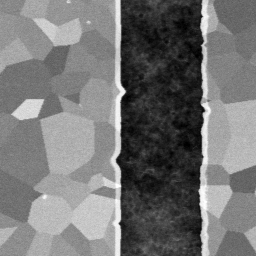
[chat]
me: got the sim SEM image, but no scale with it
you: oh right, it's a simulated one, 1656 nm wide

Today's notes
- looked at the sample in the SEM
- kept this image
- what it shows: one or a few lines or trenches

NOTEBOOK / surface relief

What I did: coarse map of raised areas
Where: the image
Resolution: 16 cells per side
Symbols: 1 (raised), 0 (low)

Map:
1111111000000111
1111111000000111
1111111000000111
1111111000000111
1111111000000111
1111111100000111
1111111000000111
1111111000000111
1111111000000111
1111111000000111
1111111000000111
1111111000000111
1111111000000111
1111111000000111
1111111000000111
1111111000000111